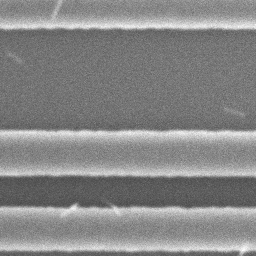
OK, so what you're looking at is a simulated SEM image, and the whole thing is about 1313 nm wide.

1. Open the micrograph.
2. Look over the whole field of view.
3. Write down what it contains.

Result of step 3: lines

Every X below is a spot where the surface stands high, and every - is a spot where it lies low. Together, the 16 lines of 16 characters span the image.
XXXXXXXXXXXXXXXX
XXXXXXXXXXXXXXXX
----------------
----------------
----------------
----------------
----------------
----------------
XXXXXXXXXXXXXXXX
XXXXXXXXXXXXXXXX
XXXXXXXXXXXXXXXX
----------------
----------------
XXXXXXXXXXXXXXXX
XXXXXXXXXXXXXXXX
XXXXXXXXXXXXXXXX